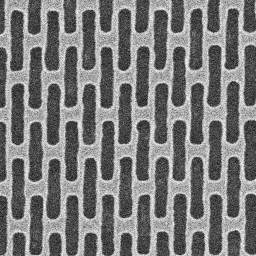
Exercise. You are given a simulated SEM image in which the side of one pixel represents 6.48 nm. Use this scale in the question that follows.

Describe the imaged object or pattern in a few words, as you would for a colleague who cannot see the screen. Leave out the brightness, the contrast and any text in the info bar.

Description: a regular array of holes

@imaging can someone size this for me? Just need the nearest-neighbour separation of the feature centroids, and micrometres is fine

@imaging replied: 0.232